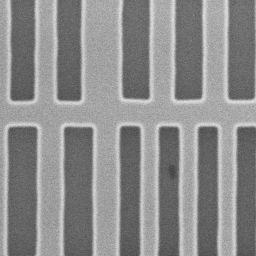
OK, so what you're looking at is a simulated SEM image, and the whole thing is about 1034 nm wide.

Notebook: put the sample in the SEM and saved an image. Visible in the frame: groups of lines, slits or small figures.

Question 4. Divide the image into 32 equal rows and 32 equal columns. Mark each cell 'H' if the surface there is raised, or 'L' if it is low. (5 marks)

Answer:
HLLLLHHLLLHHHHHLLLLHHHLLLHHHLLLL
HLLLLHHLLLHHHHHLLLLHHHLLLHHHLLLL
HLLLLHHLLLHHHHHLLLLHHHLLLHHHLLLL
HLLLLHHLLLHHHHHLLLLHHHLLLHHHLLLL
HLLLLHHLLLHHHHHLLLLHHHLLLHHHLLLL
HLLLLHHLLLHHHHHLLLLHHHLLLHHHLLLL
HLLLLHHLLLHHHHHLLLLHHHLLLHHHLLLL
HLLLLHHLLLHHHHHLLLLHHHLLLHHHLLLL
HLLLLHHLLLHHHHHLLLLHHHLLLHHHLLLL
HLLLLHHLLLHHHHHLLLLHHHLLLHHHLLLL
HLLLLHHLLLHHHHHLLLLHHHLLLHHHLLLL
HLLLLHHLLLHHHHHLLLLHHHLLLHHHLLLL
HLLLHHHLLLHHHHHHLLHHHHLLLHHHHLLL
HHHHHHHHHHHHHHHHHHHHHHHHHHHHHHHH
HHHHHHHHHHHHHHHHHHHHHHHHHHHHHHHH
HHHHHHHHHHHHHHHHHHHHHHHHHHHHHHHH
HLLLLHHHLLLLHHHLLLHHLLLHHLLHHLLL
HLLLLHHHLLLLHHHLLLHHLLLHHLLHHLLL
HLLLLHHHLLLLHHHLLLHHLLLHHLLHHLLL
HLLLLHHHLLLLHHHLLLHHLLLHHLLHHLLL
HLLLLHHHLLLLHHHLLLHHLLLHHLLHHLLL
HLLLLHHHLLLLHHHLLLHHLLLHHLLHHHLL
HLLLLHHHLLLLHHHLLLHHLLLHHLLHHLLL
HLLLLHHHLLLLHHHLLLHHLLLHHLLHHLLL
HLLLLHHHLLLLHHHLLLHHLLLHHLLHHLLL
HLLLLHHHLLLLHHHLLLHHLLLHHLLHHLLL
HLLLLHHHLLLLHHHLLLHHLLLHHLLHHLLL
HLLLLHHHLLLLHHHLLLHHLLLHHLLHHLLL
HLLLLHHHLLLLHHHLLLHHLLLHHLLHHLLL
HLLLLHHHLLLLHHHLLLHHLLLHHLLHHLLL
HLLLLHHHLLLLHHHLLLHHLLLHHLLHHLLL
HLLLLHHHLLLLHHHLLLHHLLLHHLLHHLLL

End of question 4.